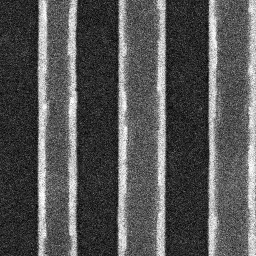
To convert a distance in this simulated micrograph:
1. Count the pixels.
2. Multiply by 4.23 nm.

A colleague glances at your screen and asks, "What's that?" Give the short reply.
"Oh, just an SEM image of one or a few lines or trenches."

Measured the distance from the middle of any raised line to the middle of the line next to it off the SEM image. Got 370 nm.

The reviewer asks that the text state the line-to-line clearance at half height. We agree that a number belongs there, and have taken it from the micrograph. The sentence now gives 201 nm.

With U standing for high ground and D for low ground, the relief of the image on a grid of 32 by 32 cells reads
DDDDDUUUUDDDDDDUUUUUDDDDDDUUUUUU
DDDDDUUUUDDDDDDUUUUUDDDDDDUUUUUU
DDDDDUUUUDDDDDDUUUUUDDDDDDUUUUUU
DDDDDUUUUDDDDDDUUUUUDDDDDDUUUUUU
DDDDDUUUUDDDDDDUUUUUDDDDDDUUUUUU
DDDDDUUUUDDDDDDUUUUUDDDDDDUUUUUU
DDDDDUUUUDDDDDDUUUUUDDDDDDUUUUUU
DDDDDUUUUDDDDDDUUUUUDDDDDDUUUUUU
DDDDDUUUUDDDDDDUUUUUDDDDDDUUUUUU
DDDDDUUUUDDDDDDUUUUUDDDDDDUUUUUU
DDDDDUUUUDDDDDDUUUUUDDDDDDUUUUUU
DDDDDUUUUDDDDDDUUUUUDDDDDDUUUUUU
DDDDDUUUUDDDDDDUUUUUDDDDDDUUUUUU
DDDDDUUUUDDDDDDUUUUUDDDDDDUUUUUU
DDDDDUUUUDDDDDDUUUUUDDDDDDUUUUUU
DDDDDUUUUDDDDDDUUUUUDDDDDDUUUUUU
DDDDDUUUUDDDDDDUUUUUDDDDDDUUUUUU
DDDDDUUUUDDDDDDUUUUUDDDDDDUUUUUU
DDDDDUUUUDDDDDDUUUUUDDDDDDUUUUUU
DDDDDUUUUDDDDDDUUUUUDDDDDDUUUUUU
DDDDDUUUUDDDDDDUUUUUDDDDDDUUUUUU
DDDDDUUUUDDDDDDUUUUUDDDDDDUUUUUU
DDDDDUUUUDDDDDDUUUUUDDDDDDUUUUUU
DDDDDUUUUDDDDDDUUUUUDDDDDDUUUUUU
DDDDDUUUUDDDDDDUUUUUDDDDDDUUUUUU
DDDDDUUUUDDDDDDUUUUUDDDDDDUUUUUU
DDDDDUUUUDDDDDDUUUUUDDDDDDUUUUUU
DDDDDUUUUDDDDDDUUUUUDDDDDDUUUUUU
DDDDDUUUUDDDDDDUUUUUDDDDDDUUUUUU
DDDDDUUUUDDDDDDUUUUUDDDDDDUUUUUU
DDDDDUUUUDDDDDDUUUUUDDDDDDUUUUUU
DDDDDUUUUDDDDDDUUUUUDDDDDDUUUUUU